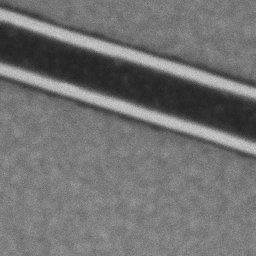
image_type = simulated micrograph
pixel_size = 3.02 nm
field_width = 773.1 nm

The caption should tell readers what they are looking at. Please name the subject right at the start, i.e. one or a few lines or trenches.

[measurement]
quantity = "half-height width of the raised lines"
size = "165 nanometers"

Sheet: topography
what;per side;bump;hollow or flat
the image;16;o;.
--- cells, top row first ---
................
oo..............
ooooo...........
ooooooooo.......
oooooooooooo....
....ooooooooooo.
.......ooooooooo
..........oooooo
.............ooo
................
................
................
................
................
................
................